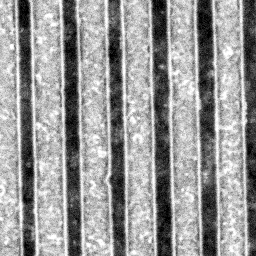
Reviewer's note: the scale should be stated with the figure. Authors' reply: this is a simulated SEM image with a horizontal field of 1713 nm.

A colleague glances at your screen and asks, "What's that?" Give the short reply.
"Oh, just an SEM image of parallel lines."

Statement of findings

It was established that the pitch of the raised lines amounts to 45.2 pixels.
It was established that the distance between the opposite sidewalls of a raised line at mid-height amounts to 120 nm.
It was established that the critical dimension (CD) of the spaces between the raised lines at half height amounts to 0.18 micrometres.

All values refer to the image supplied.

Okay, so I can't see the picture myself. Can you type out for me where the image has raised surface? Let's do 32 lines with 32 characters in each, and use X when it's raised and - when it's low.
--XX----XX---XX----XX---XXX---XX
--XX----XX---XX----XX---XXX---XX
--XX----XX---XX----XX---XXX---XX
--XX----XX---XX----XX---XXX---XX
--XX----XX---XX----XX---XXX---XX
--XX----XX---XX----XX----XX---XX
--XX----XX---XX----XX----XX---XX
--XX----XX---XX----XX----XX---XX
--XX----XX---XX----XX----XX---XX
--XX----XX---XXX---XX----XX---XX
--XX----XX---XXX---XX----XX---XX
--XX----XX----XX---XX----XX---XX
--XX----XX----XX---XX----XX---XX
--XX----XX----XX---XX----XX---XX
--XX----XX----XX---XX----XX---XX
--XX----XX----XX---XX----XX---XX
--XX----XX----XX---XX----XX---XX
--XX----XX----XX---XX----XX----X
--XX----XX----XX---XX----XX----X
--XX----XX----XX---XX----XX----X
--XXX---XX----XX---XX----XX----X
---X----XX----XX---XXX---XX----X
---X----XX---XXX---XXX---XX----X
---X----XX----XX---XXX---XX----X
---X----XX----XX---XXX---XX----X
---XX---XX----XX---XXX---XX----X
---XX---XX----XX---XXX---XX----X
---XX---XX----XX---XXX---XX----X
---XX---XX----XX---XXX---XX----X
---XX---XX----XX---XXX---XX----X
---XX---XX----XX---XXX---XX----X
---XX---XX----XX---XXX---XX----X